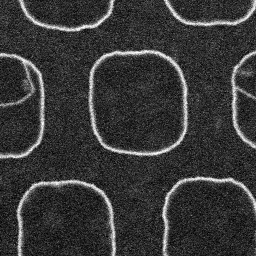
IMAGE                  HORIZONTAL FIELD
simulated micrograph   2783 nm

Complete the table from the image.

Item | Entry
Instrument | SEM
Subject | raised bodies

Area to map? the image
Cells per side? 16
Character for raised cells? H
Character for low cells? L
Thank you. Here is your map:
LHHHHHHLLLLHHHHH
LLHHHHLLLLLLHLLL
LLLLLLLLLLLLLLLL
HLLLLLLHHHLLLLLL
HHLLLLHHHHHLLLLH
HHHLLLHHHHHHLLLH
HHHLLLHHHHHHLLLH
HHHLLLHHHHHHLLLH
HHHLLLHHHHHLLLLH
HHLLLLLLHHLLLLLL
LLLLLLLLLLLLLLLL
LLHHHLLLLLLHHHHL
LHHHHHHLLLHHHHHH
LHHHHHHLLLHHHHHH
LHHHHHHLLLHHHHHH
LHHHHHHLLLHHHHHH